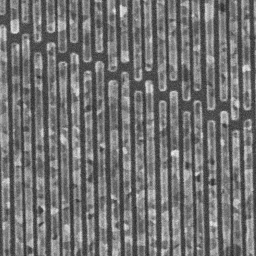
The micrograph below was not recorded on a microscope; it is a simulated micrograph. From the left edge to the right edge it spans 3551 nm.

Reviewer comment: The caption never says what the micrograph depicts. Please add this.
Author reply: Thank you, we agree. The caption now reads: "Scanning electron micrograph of parallel lines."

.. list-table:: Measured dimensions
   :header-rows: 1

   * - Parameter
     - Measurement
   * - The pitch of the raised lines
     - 169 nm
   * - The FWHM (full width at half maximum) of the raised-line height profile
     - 83.2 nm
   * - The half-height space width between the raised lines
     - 81.5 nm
